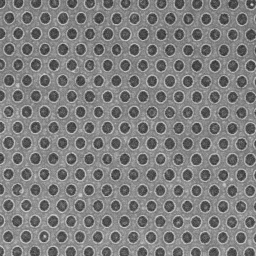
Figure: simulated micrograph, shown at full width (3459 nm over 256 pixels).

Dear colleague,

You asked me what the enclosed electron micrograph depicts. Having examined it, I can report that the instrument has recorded a regular array of holes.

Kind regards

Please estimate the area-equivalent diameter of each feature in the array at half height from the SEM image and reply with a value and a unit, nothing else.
152 nanometers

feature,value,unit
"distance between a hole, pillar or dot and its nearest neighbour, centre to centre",0.24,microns